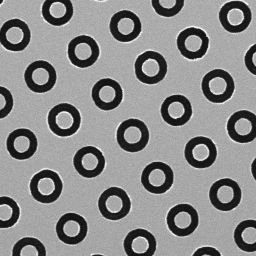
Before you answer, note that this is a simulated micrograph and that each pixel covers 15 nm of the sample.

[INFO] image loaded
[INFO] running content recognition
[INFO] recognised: a regular array of ring-shaped grooves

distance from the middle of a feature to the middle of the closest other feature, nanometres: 733